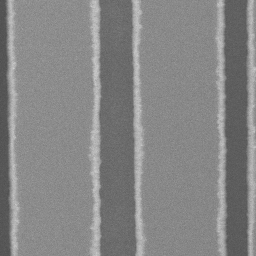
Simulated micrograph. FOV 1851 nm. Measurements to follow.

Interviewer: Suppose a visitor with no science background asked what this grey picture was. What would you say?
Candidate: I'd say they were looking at lines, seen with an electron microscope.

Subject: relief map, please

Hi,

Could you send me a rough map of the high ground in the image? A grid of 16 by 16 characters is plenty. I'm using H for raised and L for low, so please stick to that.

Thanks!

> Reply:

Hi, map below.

HHHHHHLLHHHHHHLL
HHHHHHLLHHHHHHLL
HHHHHHLLHHHHHHLL
HHHHHHLLHHHHHHLL
HHHHHHLLHHHHHHLL
LHHHHHLLHHHHHHLL
LHHHHHLLHHHHHHLL
LHHHHHLLHHHHHHLL
LHHHHHLLHHHHHHLL
LHHHHHLLHHHHHHLL
LHHHHHLLHHHHHHLL
LHHHHHLLHHHHHHLL
LHHHHHLLHHHHHHLL
LHHHHHLLHHHHHHLL
LHHHHHLLLHHHHHLL
LHHHHHLLLHHHHHLL